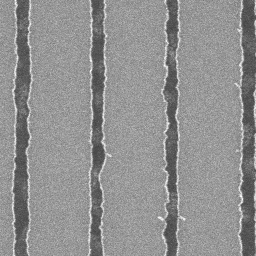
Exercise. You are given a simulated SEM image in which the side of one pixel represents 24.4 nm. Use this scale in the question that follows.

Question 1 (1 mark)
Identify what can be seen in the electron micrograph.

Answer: one or a few lines or trenches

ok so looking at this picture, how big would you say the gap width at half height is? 1.51 µm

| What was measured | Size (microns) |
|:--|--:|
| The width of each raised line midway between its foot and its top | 0.32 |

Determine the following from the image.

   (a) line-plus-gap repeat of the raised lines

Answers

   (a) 1830 nm